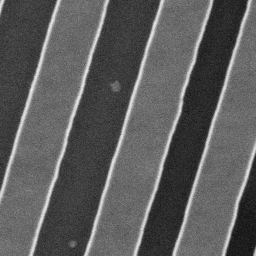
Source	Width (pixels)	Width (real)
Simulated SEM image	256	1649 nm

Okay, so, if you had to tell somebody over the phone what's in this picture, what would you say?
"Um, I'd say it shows lines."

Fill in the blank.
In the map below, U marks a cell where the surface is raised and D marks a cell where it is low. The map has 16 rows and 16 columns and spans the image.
DDDUUUUDDDUUUDDU
DDDUUUDDDDUUUDDU
DDDUUUDDDUUUUDDU
DDDUUUDDDUUUDDDU
DDUUUDDDDUUUDDUU
DDUUUDDDUUUUDDUU
DDUUUDDDUUUDDDUU
DUUUUDDDUUUDDUUU
DUUUDDDDUUUDDUUU
DUUUDDDUUUDDDUUU
UUUUDDDUUUDDUUUU
UUUDDDDUUUDDUUUD
UUUDDDUUUUDDUUUD
UUUDDDUUUDDDUUUD
UUDDDDUUUDDUUUDD
UUDDDUUUUDDUUUDD